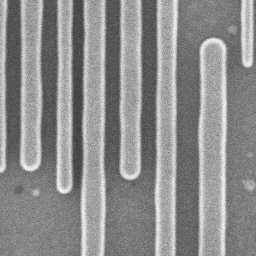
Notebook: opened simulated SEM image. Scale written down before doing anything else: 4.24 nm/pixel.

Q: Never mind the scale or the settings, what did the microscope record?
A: groups of lines, slits or small figures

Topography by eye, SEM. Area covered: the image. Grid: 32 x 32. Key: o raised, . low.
o..oo..oo..oo..ooo..oo........oo
o..oo..oo..oo..ooo..oo........oo
o..oo..oo..oo..ooo..oo........oo
o..oo..oo..oo..ooo..oo........oo
o..oo..oo..oo..ooo..oo........oo
o..oo..oo..oo..ooo..oo...ooo..oo
o..oo..oo..oo..ooo..oo...ooo..o.
o..oo..oo..oo..ooo..oo...ooo..o.
o..oo..oo..oo..ooo..oo...ooo....
o..oo..oo..oo..ooo..oo...ooo....
o..oo..oo..oo..ooo..oo...ooo....
o..oo..oo..oo..ooo..oo...ooo....
o..oo..oo..oo..ooo..oo...ooo....
o..oo..oo..oo..ooo..oo...ooo....
o..oo..oo.ooo..ooo..oo...ooo....
o..oo..oo.ooo..oo...oo...ooo....
o..oo..oo.ooo..oo...oo...ooo....
o..oo..oo.ooo..oo...oo...ooo....
o..oo..oo..oo..ooo..oo...ooo....
o..oo..oo..oo..ooo..oo...ooo....
o..oo..oo..oo..ooo..oo...ooo....
.......oo.ooo..oo...oo...ooo....
.......oo.ooo.......oo...ooo....
.......oo.ooo.......oo...ooo....
..........ooo.......oo...ooo....
..........ooo.......oo...ooo....
..........ooo.......oo...ooo....
..........ooo.......oo...ooo....
..........ooo.......oo...ooo....
..........ooo.......oo...ooo....
..........ooo.......oo...ooo....
..........ooo.......oo...ooo....